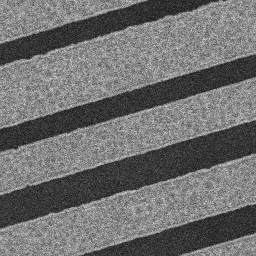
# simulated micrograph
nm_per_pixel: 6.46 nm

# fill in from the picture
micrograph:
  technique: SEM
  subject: one or a few lines or trenches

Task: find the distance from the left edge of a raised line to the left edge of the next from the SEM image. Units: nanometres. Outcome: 482